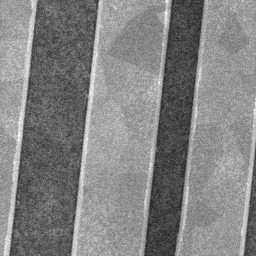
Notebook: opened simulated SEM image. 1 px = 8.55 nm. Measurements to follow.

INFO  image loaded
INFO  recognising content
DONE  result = one or a few lines or trenches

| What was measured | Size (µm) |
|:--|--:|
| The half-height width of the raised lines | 0.585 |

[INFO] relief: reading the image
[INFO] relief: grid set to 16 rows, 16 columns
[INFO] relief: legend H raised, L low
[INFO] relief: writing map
HHLLLLHHHHHLLHHH
HHLLLLHHHHLLLHHH
HHLLLLHHHHLLLHHH
HHLLLLHHHHLLLHHH
HHLLLLHHHHLLHHHH
HHLLLLHHHHLLHHHH
HLLLLLHHHHLLHHHH
HLLLLLHHHHLLHHHH
HLLLLHHHHHLLHHHH
HLLLLHHHHHLLHHHH
HLLLLHHHHLLLHHHH
HLLLLHHHHLLLHHHH
HLLLLHHHHLLLHHHL
HLLLLHHHHLLHHHHL
HLLLLHHHHLLHHHHL
LLLLLHHHHLLHHHHL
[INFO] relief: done